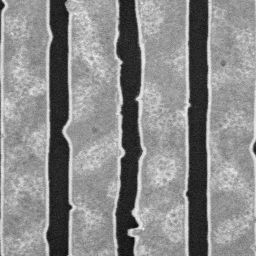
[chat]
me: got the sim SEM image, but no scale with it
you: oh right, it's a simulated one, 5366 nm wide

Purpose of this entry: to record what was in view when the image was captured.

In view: one or a few lines or trenches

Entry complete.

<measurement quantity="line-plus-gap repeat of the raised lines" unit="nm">1450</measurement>